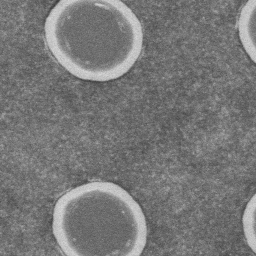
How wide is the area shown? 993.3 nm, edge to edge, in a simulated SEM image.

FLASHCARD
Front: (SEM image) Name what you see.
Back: raised bodies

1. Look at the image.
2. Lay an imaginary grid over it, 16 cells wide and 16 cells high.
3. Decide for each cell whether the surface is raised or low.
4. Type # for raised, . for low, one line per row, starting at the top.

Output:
....####........
...#####.......#
...######......#
....####........
.....##.........
................
................
................
................
................
................
................
....####........
....#####.......
....#####.......
....#####.......